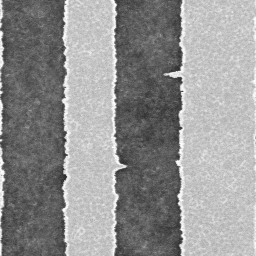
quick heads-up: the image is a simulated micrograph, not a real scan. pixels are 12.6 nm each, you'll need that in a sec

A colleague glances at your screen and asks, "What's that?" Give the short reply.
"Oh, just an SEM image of one or a few lines or trenches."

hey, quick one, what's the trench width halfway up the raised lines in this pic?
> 825 nanometres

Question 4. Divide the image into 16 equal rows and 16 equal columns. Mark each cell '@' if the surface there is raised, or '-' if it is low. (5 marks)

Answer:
----@@@----@@@@@
----@@@----@@@@@
----@@@----@@@@@
----@@@----@@@@@
----@@@----@@@@@
----@@@----@@@@@
----@@@----@@@@@
----@@@----@@@@@
----@@@----@@@@@
----@@@----@@@@@
----@@@----@@@@@
----@@@----@@@@@
----@@@----@@@@@
----@@@----@@@@@
----@@@----@@@@@
----@@@----@@@@@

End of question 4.